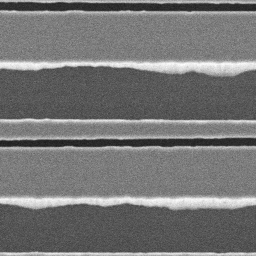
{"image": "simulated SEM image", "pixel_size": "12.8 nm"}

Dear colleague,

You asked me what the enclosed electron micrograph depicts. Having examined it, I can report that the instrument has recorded lines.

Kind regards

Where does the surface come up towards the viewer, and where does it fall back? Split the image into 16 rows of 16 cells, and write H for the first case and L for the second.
HHHHHHHHHHHHHHHH
HHHHHHHHHHHHHHHH
HHHHHHHHHHHHHHHH
HHHHHHHHHHHHHHHH
LLLLLLLLLLLLLLLL
LLLLLLLLLLLLLLLL
LLLLLLLLLLLLLLLL
LLLLLLLLLLLLLLLL
HHHHHHHHHHHHHHHH
HHHHHHHHHHHHHHHH
HHHHHHHHHHHHHHHH
HHHHHHHHHHHHHHHH
HHHHHHHHHHHHHHHH
LLLLLLLLLLLLLLLL
LLLLLLLLLLLLLLLL
LLLLLLLLLLLLLLLL